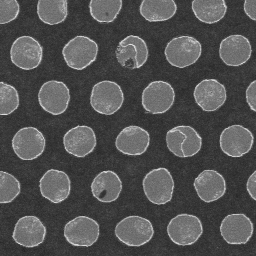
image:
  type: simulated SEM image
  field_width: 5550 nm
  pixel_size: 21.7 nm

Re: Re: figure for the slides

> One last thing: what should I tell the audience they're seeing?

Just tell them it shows a regular array of raised bodies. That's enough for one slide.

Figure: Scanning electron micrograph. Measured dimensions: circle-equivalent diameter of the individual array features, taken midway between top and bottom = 698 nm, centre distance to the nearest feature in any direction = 1090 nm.